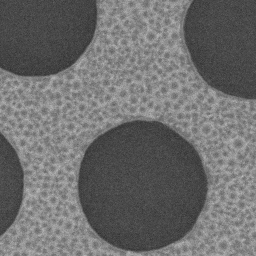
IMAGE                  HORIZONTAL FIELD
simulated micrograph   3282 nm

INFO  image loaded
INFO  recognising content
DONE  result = holes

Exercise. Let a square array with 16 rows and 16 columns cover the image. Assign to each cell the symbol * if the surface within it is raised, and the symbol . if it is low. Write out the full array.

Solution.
......******....
......*****.....
......******....
.....*******....
....********....
*************...
****************
********.*******
******.....*****
.****.......****
.****........***
.****........***
.****........***
.****.......****
******......****
*******...******